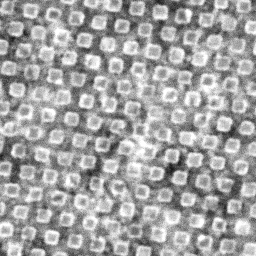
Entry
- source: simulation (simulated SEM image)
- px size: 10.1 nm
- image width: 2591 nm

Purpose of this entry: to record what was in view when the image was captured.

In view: a regular array of raised bodies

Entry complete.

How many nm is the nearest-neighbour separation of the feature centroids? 232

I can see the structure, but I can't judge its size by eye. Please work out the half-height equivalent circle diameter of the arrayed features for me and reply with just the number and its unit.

138 nanometres